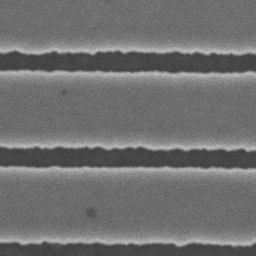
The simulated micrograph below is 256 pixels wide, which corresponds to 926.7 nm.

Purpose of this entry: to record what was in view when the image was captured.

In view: lines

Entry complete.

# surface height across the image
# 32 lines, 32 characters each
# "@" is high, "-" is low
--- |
@@@@@@@@@@@@@@@@@@@@@@@@@@@@@@@@
@@@@@@@@@@@@@@@@@@@@@@@@@@@@@@@@
@@@@@@@@@@@@@@@@@@@@@@@@@@@@@@@@
@@@@@@@@@@@@@@@@@@@@@@@@@@@@@@@@
@@@@@@@@@@@@@@@@@@@@@@@@@@@@@@@@
@@@@@@@@@@@@@@@@@@@@@@@@@@@@@@@@
@-@@@@-@@@@@@--@-@@@@@@@@@@@@@@@
--------------------------------
--------------------------------
@@@@@@@@@@@@@@@@@@@@@@@@@@@@@@@@
@@@@@@@@@@@@@@@@@@@@@@@@@@@@@@@@
@@@@@@@@@@@@@@@@@@@@@@@@@@@@@@@@
@@@@@@@@@@@@@@@@@@@@@@@@@@@@@@@@
@@@@@@@@@@@@@@@@@@@@@@@@@@@@@@@@
@@@@@@@@@@@@@@@@@@@@@@@@@@@@@@@@
@@@@@@@@@@@@@@@@@@@@@@@@@@@@@@@@
@@@@@@@@@@@@@@@@@@@@@@@@@@@@@@@@
@@@@@@@@@@@@@@@@@@@@@@@@@@@@@@@@
---@-@@------@@@--@@@@@@@@@@@@@@
--------------------------------
--------------------------------
@@@@@@@@@@@@@@@@@@@@@@@@@@@@@@@@
@@@@@@@@@@@@@@@@@@@@@@@@@@@@@@@@
@@@@@@@@@@@@@@@@@@@@@@@@@@@@@@@@
@@@@@@@@@@@@@@@@@@@@@@@@@@@@@@@@
@@@@@@@@@@@@@@@@@@@@@@@@@@@@@@@@
@@@@@@@@@@@@@@@@@@@@@@@@@@@@@@@@
@@@@@@@@@@@@@@@@@@@@@@@@@@@@@@@@
@@@@@@@@@@@@@@@@@@@@@@@@@@@@@@@@
@@@@@@@@@@@@@@@@@@@@@@@@@@@@@@@@
---@---------@@@-@----@@--@@@@@@
--------------------------------